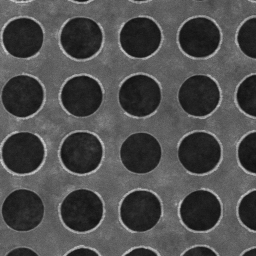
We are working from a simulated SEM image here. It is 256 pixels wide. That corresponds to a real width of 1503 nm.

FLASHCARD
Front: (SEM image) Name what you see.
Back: a regular array of holes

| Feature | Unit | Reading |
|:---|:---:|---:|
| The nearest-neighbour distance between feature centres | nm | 336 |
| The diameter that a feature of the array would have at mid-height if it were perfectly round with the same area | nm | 244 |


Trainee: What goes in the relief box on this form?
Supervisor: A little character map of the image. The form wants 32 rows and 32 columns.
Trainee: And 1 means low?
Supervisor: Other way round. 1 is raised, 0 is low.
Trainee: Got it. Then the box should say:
11111111111111111111111111111111
11111111111111111111111111111111
11001111100011110001111100111110
10000111000011100000111000011100
00000111000001100000110000001100
00000111000001100000110000011100
10000111000011110001111000011100
11111111111111111111111111111111
11111111111111111111111111111111
11001111110111111011111100111110
10000111000011100000111000011100
00000111000001100000110000011100
00000111000001100000110000011100
10000111000011100000111000011100
11001111100111111011111111111111
11111111111111111111111111111111
11111111111111111111111111111111
10000111000011110000111000011100
00000111000001100000110000001100
00000111000001100000110000001100
10000111000011100000111000011100
11001111100111111001111100111110
11111111111111111111111111111111
11111111111111111111111111111111
10000111000011110001111000011110
00000111000001100000111000011100
00000111000001100000110000001100
10000111000001100000111000011100
10001111100011110001111100111110
11111111111111111111111111111111
11111111111111111111111111111111
10001111100011110001111000011110